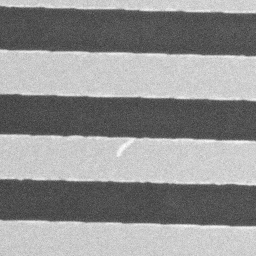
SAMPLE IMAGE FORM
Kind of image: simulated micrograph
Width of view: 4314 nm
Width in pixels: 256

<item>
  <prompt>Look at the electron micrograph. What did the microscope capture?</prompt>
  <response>lines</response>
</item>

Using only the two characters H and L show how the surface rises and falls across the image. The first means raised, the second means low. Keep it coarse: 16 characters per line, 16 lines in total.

LLLLHHHHHHHHHHHH
LLLLLLLLLLLLLLLL
LLLLLLLLLLLLLLLL
HHHHHHHHHHHHHLLL
HHHHHHHHHHHHHHHH
HHHHHHHHHHHHHHHH
LLLLLLLLLLLLLLLL
LLLLLLLLLLLLLLLL
HHLLLLLLLLLLLLLL
HHHHHHHHHHHHHHHH
HHHHHHHHHHHHHHHH
LLLLLLLLLLLLLHHH
LLLLLLLLLLLLLLLL
LLLLLLLLLLLLLLLL
HHHHHHHHHHHHHHHH
HHHHHHHHHHHHHHHH